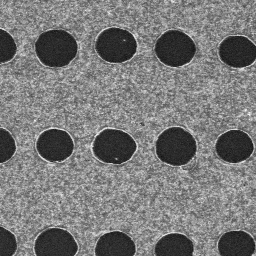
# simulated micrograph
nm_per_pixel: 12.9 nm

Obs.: holes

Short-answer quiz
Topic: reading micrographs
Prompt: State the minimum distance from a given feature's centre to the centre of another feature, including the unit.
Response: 0.762 um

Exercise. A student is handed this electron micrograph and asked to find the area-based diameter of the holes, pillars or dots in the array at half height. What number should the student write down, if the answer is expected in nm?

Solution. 506